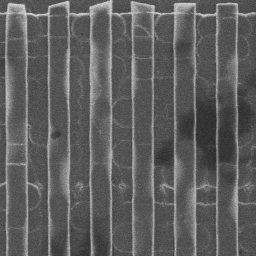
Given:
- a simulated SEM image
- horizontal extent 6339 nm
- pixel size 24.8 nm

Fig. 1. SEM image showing wiring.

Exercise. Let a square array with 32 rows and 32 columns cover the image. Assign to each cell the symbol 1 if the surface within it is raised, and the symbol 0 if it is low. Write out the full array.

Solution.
00000001000000000000000000000000
01100011100111000110001100011100
01100011100111000110001100011100
01100011100111000110001100011100
01100011100111000110001100011100
01100011100111000110001100011100
01100011100111000110001100011100
01100011100011000110001100011100
01100011100011000110001100011000
01100011100011000110001100011100
01100011100011000110001100011100
01100011100011000110001100011000
01100011100111000110001100011100
01100011100111000110001100011100
01100011100111000110001100011100
01100011100111000110001100011100
01100011100111000110001100011100
01100011100111000110001100011100
01100011100111000110001100011100
01100011100111000110001100011100
01100011100111000110001100011100
01100011000111000110001100011100
01100011000111000110001100011100
01100011000111000110001100011100
01100011100111000110001100011100
01100011100111000110001100011000
01100011100111000110001100011100
01100011100111000110001100011100
01100011100111000110001100011100
01100011100111000110001100011100
01100011100111000110001100011100
01100011100111000110001100011100